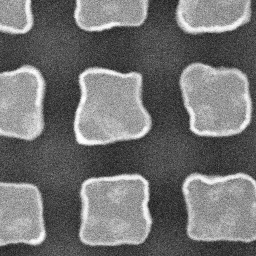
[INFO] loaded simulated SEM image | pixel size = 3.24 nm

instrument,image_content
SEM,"raised bodies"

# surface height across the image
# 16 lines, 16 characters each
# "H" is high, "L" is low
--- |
HHLLLHHHHLLHHHHH
HHLLLHHHHLLHHHHL
LLLLLLLLLLLLLLLL
LLLLLLLLLLLLLLLL
LHLLLHHLLLLLHHHL
HHHLLHHHHLLHHHHL
HHHLLHHHHLLLHHHH
HHHLLHHHHLLLHHHH
LHLLLHHHHLLLLLLL
LLLLLLLLLLLLLLLL
LLLLLLLLLLLLLLLL
HLLLLHHHHLLLHHHH
HHHLLHHHHLLLHHHH
HHHLLHHHHLLLHHHH
HHHLLHHHHLLLHHHH
LLLLLLLLLLLLLLLL